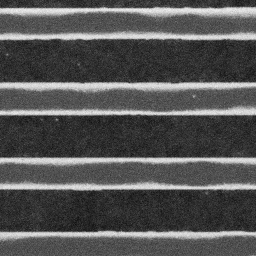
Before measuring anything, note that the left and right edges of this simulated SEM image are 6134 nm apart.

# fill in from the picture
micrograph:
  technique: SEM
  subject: lines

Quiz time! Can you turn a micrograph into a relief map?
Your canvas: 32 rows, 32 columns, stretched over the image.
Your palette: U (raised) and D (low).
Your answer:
DDDDDDDDDDDDDDDDDDDDDDDDDDDDDDDD
UUUUUUUUUUUUUUUUUUUUUUUUUUUUUUUU
UUUUUUUUUUUUUUUUUUUUUUUUUUUUUUUU
UUUUUUUUUUUUUUUUUUUUUUUUUUUUUUUU
UUUUUUUUUUUUUUUUUUUUUUUUUUUUUUUU
DDDDDDDDDDDDDDDDDDDDDDDDDDDDDDDD
DDDDDDDDDDDDDDDDDDDDDDDDDDDDDDDD
DDDDDDDDDDDDDDDDDDDDDDDDDDDDDDDD
DDDDDDDDDDDDDDDDDDDDDDDDDDDDDDDD
DDDDDDDDDDDDDDDDDDDDDDDDDDDDDDDD
DDDDDDDDDDDDDDDDDDDDDDDDDDDDDDDD
UUUUUUUUUUUUUUUUUUUUUUUUUUUUUUUU
UUUUUUUUUUUUUUUUUUUUUUUUUUUUUUUU
UUUUUUUUUUUUUUUUUUUUUUUUUUUUUUUU
DDDDDDDDDDDDDDDDDDDDDDDDDDDDDDDD
DDDDDDDDDDDDDDDDDDDDDDDDDDDDDDDD
DDDDDDDDDDDDDDDDDDDDDDDDDDDDDDDD
DDDDDDDDDDDDDDDDDDDDDDDDDDDDDDDD
DDDDDDDDDDDDDDDDDDDDDDDDDDDDDDDD
DDDDDDDDDDDDDDDDDDDDDDDDDDDDDDDD
UUUUUUUUUUUUUUUUUUUUUUUUUUUUUUUU
UUUUUUUUUUUUUUUUUUUUUUUUUUUUUUUU
UUUUUUUUUUUUUUUUUUUUUUUUUUUUUUUU
DDDDUUUUUUUUUUUUUDDDUUUUUUUUUUUU
DDDDDDDDDDDDDDDDDDDDDDDDDDDDDDDD
DDDDDDDDDDDDDDDDDDDDDDDDDDDDDDDD
DDDDDDDDDDDDDDDDDDDDDDDDDDDDDDDD
DDDDDDDDDDDDDDDDDDDDDDDDDDDDDDDD
DDDDDDDDDDDDDDDDDDDDDDDDDDDDDDDD
UUUUUUUUUUUUUUUUUUUUUUUUUUUUUUUU
UUUUUUUUUUUUUUUUUUUUUUUUUUUUUUUU
UUUUUUUUUUUUUUUUUUUUUUUUUUUUUUUU